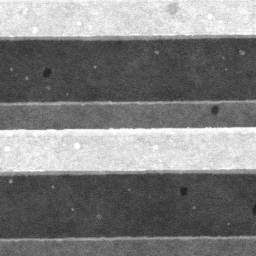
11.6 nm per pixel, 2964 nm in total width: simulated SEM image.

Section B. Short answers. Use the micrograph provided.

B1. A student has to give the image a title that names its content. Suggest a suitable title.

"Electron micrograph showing lines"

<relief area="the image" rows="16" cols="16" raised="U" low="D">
UUUUUUUUUUUUUUUU
UUUUUUUUUUUUUUUU
DDDDDDDDDDDDDDDD
DDDDDDDDDDDDDDDD
DDDDDDDDDDDDDDDD
DDDDDDDDDDDDDDDD
UUUUUUUUUUUUUUUU
UUUUUUUUUUUUUUUU
UUUUUUUUUUUUUUUU
UUUUUUUUUUUUUUUU
UUUUUUUUUUUUUUUU
DDDDDDDDDDDDDDDD
DDDDDDDDDDDDDDDD
DDDDDDDDDDDDDDDD
DDDDDDDDDDDDDDDD
UUUUUUUUUUUUUUUU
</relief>